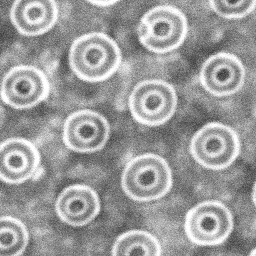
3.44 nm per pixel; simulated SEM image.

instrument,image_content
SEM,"a regular array of ring-shaped raised bodies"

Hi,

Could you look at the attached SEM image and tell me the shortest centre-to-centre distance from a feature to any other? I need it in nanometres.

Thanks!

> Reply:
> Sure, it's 253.